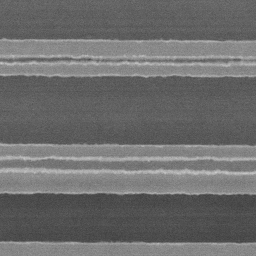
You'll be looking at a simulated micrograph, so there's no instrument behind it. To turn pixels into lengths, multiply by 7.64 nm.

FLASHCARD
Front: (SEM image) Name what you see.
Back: lines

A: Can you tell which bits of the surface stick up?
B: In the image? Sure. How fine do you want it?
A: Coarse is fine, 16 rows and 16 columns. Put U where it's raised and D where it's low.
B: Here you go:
DDDDDDDDDDDDDDDD
DDDDDDDDDDDDDDDD
DDDDDDDDDDDDDDDD
UUUUUUUUUUUUUUUU
UUUUUUUUUUUUUUUU
DDDDDDDDDDDDDDDD
DDDDDDDDDDDDDDDD
DDDDDDDDDDDDDDDD
DDDDDDDDDDDDDDDD
UUUUUUUUUUUUUUUU
UUUUUUUUUUUUUUUU
UUUUUUUUUUUUUUUU
DDDDDDDDDDDDDDDD
DDDDDDDDDDDDDDDD
DDDDDDDDDDDDDDDD
UUUUUUUUUUUUUUUU